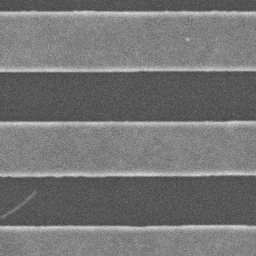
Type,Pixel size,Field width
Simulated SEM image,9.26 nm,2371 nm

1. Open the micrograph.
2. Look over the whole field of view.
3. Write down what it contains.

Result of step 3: lines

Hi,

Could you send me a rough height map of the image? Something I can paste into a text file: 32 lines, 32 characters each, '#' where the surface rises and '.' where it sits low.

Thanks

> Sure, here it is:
................................
..##.....###........#.....##.#..
################################
################################
################################
################################
################################
################################
################################
................................
................................
................................
................................
................................
................................
################################
################################
################################
################################
################################
################################
################################
................................
................................
................................
................................
................................
................................
################################
################################
################################
################################